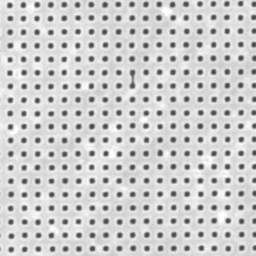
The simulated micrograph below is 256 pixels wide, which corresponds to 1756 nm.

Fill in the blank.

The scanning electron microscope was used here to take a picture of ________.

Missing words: a regular array of holes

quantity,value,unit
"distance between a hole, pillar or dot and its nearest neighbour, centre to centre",0.0892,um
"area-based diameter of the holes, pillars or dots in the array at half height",0.0438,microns